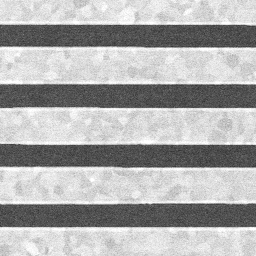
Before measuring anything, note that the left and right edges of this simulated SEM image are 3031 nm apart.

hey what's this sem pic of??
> lines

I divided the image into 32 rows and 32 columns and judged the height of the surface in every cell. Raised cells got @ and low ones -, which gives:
@@@@@@@@@@@@@@@@@@@@@@@@@@@@@@@@
@@@@@@@@@@@@@@@@@@@@@@@@@@@@@@@@
@@@@@@@@@@@@@@@@@@@@@@@@@@@@@@@@
--------------------------------
--------------------------------
--------------------------------
@@@@@@@@@@@@@@@@@@@@@@@@@@@@@@@@
@@@@@@@@@@@@@@@@@@@@@@@@@@@@@@@@
@@@@@@@@@@@@@@@@@@@@@@@@@@@@@@@@
@@@@@@@@@@@@@@@@@@@@@@@@@@@@@@@@
--------------------------------
--------------------------------
--------------------------------
--------------------------------
@@@@@@@@@@@@@@@@@@@@@@@@@@@@@@@@
@@@@@@@@@@@@@@@@@@@@@@@@@@@@@@@@
@@@@@@@@@@@@@@@@@@@@@@@@@@@@@@@@
@@@@@@@@@@@@@@@@@@@@@@@@@@@@@@@@
--------------------------------
--------------------------------
--------------------------------
@@@@@@@@@@@@@@@@@@@@@@@@@@@@@@@@
@@@@@@@@@@@@@@@@@@@@@@@@@@@@@@@@
@@@@@@@@@@@@@@@@@@@@@@@@@@@@@@@@
@@@@@@@@@@@@@@@@@@@@@@@@@@@@@@@@
--------------------------------
--------------------------------
--------------------------------
@@@@@@@@@@@@@@@@@@@@@@@@@@@@@@@@
@@@@@@@@@@@@@@@@@@@@@@@@@@@@@@@@
@@@@@@@@@@@@@@@@@@@@@@@@@@@@@@@@
@@@@@@@@@@@@@@@@@@@@@@@@@@@@@@@@